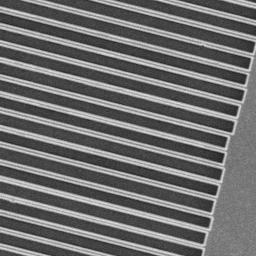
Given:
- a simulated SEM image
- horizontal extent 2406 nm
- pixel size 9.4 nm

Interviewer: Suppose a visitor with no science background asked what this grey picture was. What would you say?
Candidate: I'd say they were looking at parallel lines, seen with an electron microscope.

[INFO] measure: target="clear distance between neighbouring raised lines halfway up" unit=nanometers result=110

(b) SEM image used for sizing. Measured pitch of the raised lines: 154 nanometers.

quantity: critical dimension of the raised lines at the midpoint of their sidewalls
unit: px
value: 5.1